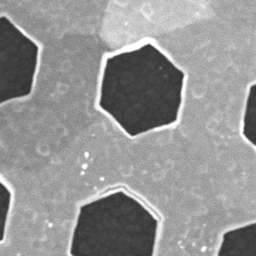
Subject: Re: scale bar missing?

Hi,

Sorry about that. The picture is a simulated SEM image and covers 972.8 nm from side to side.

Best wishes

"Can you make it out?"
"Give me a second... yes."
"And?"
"holes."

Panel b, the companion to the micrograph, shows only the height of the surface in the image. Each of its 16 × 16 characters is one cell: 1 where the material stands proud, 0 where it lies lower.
1111111111111111
0111111111111111
0011111111111111
0011111000111111
0011111000011111
0011110000011111
1111110000011110
1111111000011110
1111111111111110
1111111111111111
1111111111111111
1111111111111111
0111110011111111
1111100000111111
1111100000111100
1111000000111100